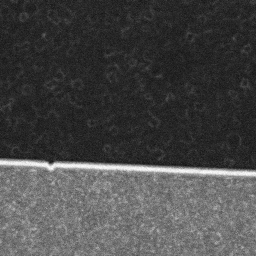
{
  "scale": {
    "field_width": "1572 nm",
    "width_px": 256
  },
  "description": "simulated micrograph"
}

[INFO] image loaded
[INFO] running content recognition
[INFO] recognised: one or a few lines or trenches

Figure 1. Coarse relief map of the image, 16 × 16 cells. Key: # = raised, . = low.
................
................
................
................
................
................
................
................
................
................
########........
################
################
################
################
################